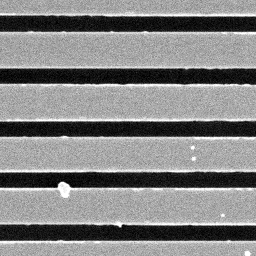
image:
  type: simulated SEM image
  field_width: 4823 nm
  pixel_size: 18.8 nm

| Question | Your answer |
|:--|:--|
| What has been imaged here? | lines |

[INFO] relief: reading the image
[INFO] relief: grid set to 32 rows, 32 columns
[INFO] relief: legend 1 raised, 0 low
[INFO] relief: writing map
11111111111111111111111111111111
11111111111111111111111111111111
00000000000000000000000000000000
00000000000000000000000000000000
11111111111111111111111111111111
11111111111111111111111111111111
11111111111111111111111111111111
11111111111111111111111111111111
00000000000000000000000100111000
00000000000000000000000000000000
00000000000000000000000000000000
11111111111111111111111111111111
11111111111111111111111111111111
11111111111111111111111111111111
11111111111111111111111111111111
00000000000000000000000000000000
00000000000000000000000000000000
11111111111111111111111111111111
11111111111111111111111111111111
11111111111111111111111111111111
11111111111111111111111111111111
00000000000000000000000000000000
00000000000000000000000000000000
00000001100000000000000000000000
11111111111111111111111111111111
11111111111111111111111111111111
11111111111111111111111111111111
11111111111111111111111111111111
00000000000000000000000000000000
00000000000000000000000000000000
11111111111111111111111111111111
11111111111111111111111111111111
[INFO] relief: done